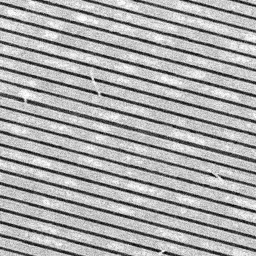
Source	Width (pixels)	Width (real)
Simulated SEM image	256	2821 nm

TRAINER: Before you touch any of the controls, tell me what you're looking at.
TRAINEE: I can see parallel lines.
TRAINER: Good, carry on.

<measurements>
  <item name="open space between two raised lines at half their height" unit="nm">40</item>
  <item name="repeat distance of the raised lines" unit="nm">137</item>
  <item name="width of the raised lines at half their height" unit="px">8.95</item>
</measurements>